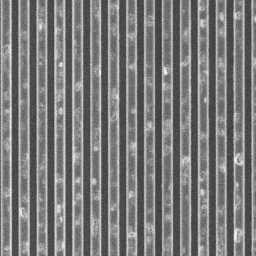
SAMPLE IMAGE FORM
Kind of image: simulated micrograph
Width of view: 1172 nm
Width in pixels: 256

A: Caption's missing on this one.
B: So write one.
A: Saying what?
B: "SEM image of parallel lines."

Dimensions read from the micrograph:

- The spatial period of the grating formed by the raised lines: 82.1 nm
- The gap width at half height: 36.1 nanometers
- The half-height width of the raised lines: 45.2 nanometres